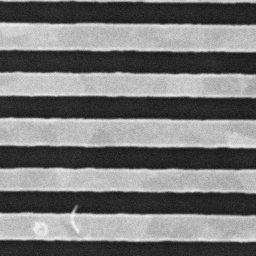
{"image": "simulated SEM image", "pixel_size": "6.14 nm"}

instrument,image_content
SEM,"lines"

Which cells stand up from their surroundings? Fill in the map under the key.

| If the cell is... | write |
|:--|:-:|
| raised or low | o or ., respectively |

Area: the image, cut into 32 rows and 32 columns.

................................
................................
................................
oooooooooooooooooooooooooooooooo
oooooooooooooooooooooooooooooooo
oooooooooooooooooooooooooooooooo
................................
................................
................................
oooooooooooooooooooooooooooooooo
oooooooooooooooooooooooooooooooo
oooooooooooooooooooooooooooooooo
................................
................................
................................
oooooooooooooooooooooooooooooooo
oooooooooooooooooooooooooooooooo
oooooooooooooooooooooooooooooooo
................................
................................
................................
oooooooooooooooooooooooooooooooo
oooooooooooooooooooooooooooooooo
oooooooooooooooooooooooooooooooo
................................
................................
................................
oooooooooooooooooooooooooooooooo
oooooooooooooooooooooooooooooooo
oooooooooooooooooooooooooooooooo
................................
................................